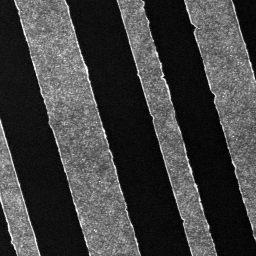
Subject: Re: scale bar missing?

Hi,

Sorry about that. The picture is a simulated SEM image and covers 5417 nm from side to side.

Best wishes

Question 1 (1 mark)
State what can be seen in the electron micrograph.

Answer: one or a few lines or trenches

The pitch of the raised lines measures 1770 nm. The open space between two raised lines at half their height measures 1.01 µm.